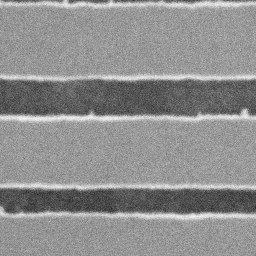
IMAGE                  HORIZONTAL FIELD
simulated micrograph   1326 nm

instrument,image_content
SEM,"lines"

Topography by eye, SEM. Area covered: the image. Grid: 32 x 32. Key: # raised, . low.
########.##...#########.########
################################
################################
################################
################################
################################
################################
################################
################################
################################
................................
................................
................................
................................
...........................###..
################################
################################
################################
################################
################################
################################
################################
################################
.....########......#.##..#######
................................
................................
................................
################################
################################
################################
################################
################################